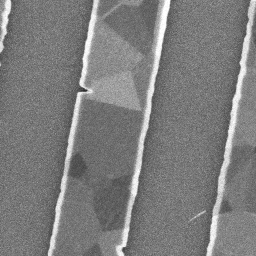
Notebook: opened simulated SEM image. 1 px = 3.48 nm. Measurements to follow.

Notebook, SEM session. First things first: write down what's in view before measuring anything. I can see one or a few lines or trenches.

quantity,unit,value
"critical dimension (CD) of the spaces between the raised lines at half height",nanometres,292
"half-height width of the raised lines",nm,251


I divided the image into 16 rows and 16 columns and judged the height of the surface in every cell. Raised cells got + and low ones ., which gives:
+.....++++......
......++++......
.....+++++.....+
.....+++++.....+
.....+++++.....+
.....+++++.....+
.....++++......+
.....++++......+
....+++++.....++
....+++++.....++
....+++++.....++
....+++++.....++
....++++......++
....++++.....+++
...+++++.....+++
...+++++.....+++